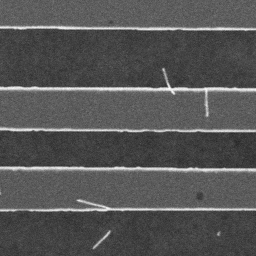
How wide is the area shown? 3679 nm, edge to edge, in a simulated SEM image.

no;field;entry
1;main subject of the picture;lines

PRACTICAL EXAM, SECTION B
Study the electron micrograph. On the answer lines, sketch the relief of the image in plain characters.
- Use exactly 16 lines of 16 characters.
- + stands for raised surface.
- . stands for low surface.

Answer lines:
++++++++++++++++
++++++++++++++++
................
................
................
..........+.....
++++++++++++++++
++++++++++++++++
................
................
+++++...........
++++++++++++++++
++++++++++++++++
................
................
................